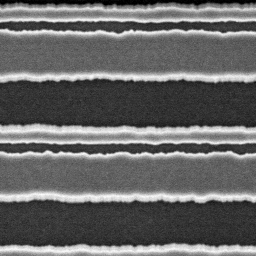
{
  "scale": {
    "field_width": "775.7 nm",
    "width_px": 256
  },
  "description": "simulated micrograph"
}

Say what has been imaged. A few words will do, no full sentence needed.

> lines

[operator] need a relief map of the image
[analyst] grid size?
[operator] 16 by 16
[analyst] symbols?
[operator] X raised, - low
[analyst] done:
XXXXXXX--XXXXXXX
XXXXXXXXXXXXXXXX
XXXXXXXXXXXXXXXX
XXXXXXXXXXXXXXXX
XXXXXXXXXXXXXXXX
----------------
----------------
----------------
XXXXXXXXXXXXXXXX
XXXXXXXXXXXXXXXX
XXXXXXXXXXXXXXXX
XXXXXXXXXXXXXXXX
----------------
----------------
----------------
----------------